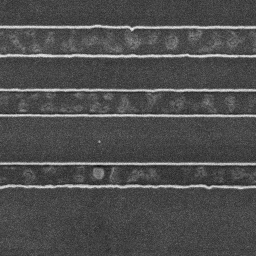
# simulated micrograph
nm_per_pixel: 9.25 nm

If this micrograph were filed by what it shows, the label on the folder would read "one or a few lines or trenches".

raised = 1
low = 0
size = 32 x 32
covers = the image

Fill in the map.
11111111111111111111111111111111
11111111111111111111111111111111
11111111111111111111111111111111
00000000000000001000000000000000
00000000000000000000000000000000
00000000000000000000000000000000
00000000000000000000000000000000
11111111111111111111111111111111
11111111111111111111111111111111
11111111111111111111111111111111
11111111111111111111111111111111
00000000000000000000000000000000
00000000000000000000000000000000
00000000000000000000000000000000
11111111111111111111111111111011
11111111111111111111111111111111
11111111111111111111111111111111
11111111111111111111111111111111
11111111111111111111111111111111
11111111111111111111111111111111
00000000000000000000000111111111
00000000000000000000000000000000
00000000000000000000000000000000
11111111111111111111111111111111
11111111111111111111111111111111
11111111111111111111111111111111
11111111111111111111111111111111
11111111111111111111111111111111
11111111111111111111111111111111
11111111111111111111111111111111
11111111111111111111111111111111
11111111111111111111111111111111